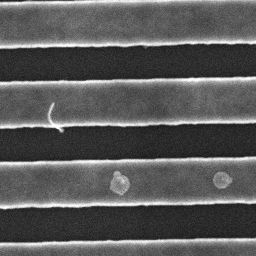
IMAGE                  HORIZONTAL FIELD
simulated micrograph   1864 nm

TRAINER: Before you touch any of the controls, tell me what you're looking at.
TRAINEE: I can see lines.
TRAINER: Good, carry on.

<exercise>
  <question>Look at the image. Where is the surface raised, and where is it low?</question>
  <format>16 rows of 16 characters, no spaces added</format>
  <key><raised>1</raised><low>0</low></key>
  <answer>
1111111111111111
1111111111111111
1111111111111111
0000000000000000
0000000000000000
1111111111111111
1111111111111111
1111111111111111
0000000000000000
0000000000000000
1111111111111111
1111111111111111
1111111111111111
0000000000000000
0000000000000000
1111111111111111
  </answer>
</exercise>